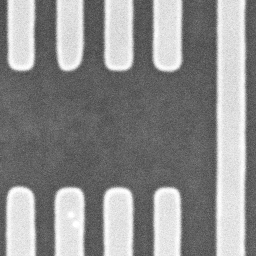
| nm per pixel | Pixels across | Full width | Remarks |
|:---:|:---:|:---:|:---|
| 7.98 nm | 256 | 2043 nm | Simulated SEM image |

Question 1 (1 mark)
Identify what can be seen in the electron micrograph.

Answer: wiring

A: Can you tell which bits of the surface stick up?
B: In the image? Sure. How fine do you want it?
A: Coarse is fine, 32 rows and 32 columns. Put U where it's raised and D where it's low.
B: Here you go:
DUUUDDDUUUDDDUUUDDDUUUUDDDDUUUDD
DUUUDDDUUUDDDUUUDDDUUUUDDDDUUUDD
DUUUDDDUUUDDDUUUDDDUUUUDDDDUUUDD
DUUUDDDUUUDDDUUUDDDUUUUDDDDUUUDD
DUUUDDDUUUDDDUUUDDDUUUUDDDDUUUDD
DUUUDDDUUUDDDUUUDDDUUUUDDDDUUUDD
DUUUDDDUUUDDDUUUDDDUUUUDDDDUUUDD
DUUUDDDUUUDDDUUUDDDUUUUDDDDUUUDD
DDUUDDDDUDDDDDUUDDDDUUDDDDDUUUDD
DDDDDDDDDDDDDDDDDDDDDDDDDDDUUUDD
DDDDDDDDDDDDDDDDDDDDDDDDDDDUUUDD
DDDDDDDDDDDDDDDDDDDDDDDDDDDUUUDD
DDDDDDDDDDDDDDDDDDDDDDDDDDDUUUDD
DDDDDDDDDDDDDDDDDDDDDDDDDDDUUUDD
DDDDDDDDDDDDDDDDDDDDDDDDDDDUUUDD
DDDDDDDDDDDDDDDDDDDDDDDDDDDUUUDD
DDDDDDDDDDDDDDDDDDDDDDDDDDDUUUDD
DDDDDDDDDDDDDDDDDDDDDDDDDDDUUUDD
DDDDDDDDDDDDDDDDDDDDDDDDDDDUUUDD
DDDDDDDDDDDDDDDDDDDDDDDDDDDUUUDD
DDDDDDDDDDDDDDDDDDDDDDDDDDDUUUDD
DDDDDDDDDDDDDDDDDDDDDDDDDDDUUUDD
DDDDDDDDDDDDDDDDDDDDDDDDDDDUUUDD
DDDDDDDDDDDDDDDDDDDDDDDDDDDUUUDD
DUUUDDDUUUDDDUUUDDDUUUDDDDDUUUDD
DUUUDDDUUUDDDUUUDDDUUUDDDDDUUUDD
DUUUDDDUUUDDDUUUDDDUUUDDDDDUUUDD
DUUUDDDUUUDDDUUUDDDUUUDDDDDUUUDD
DUUUDDDUUUDDDUUUDDDUUUDDDDDUUUDD
DUUUDDDUUUDDDUUUDDDUUUDDDDDUUUDD
DUUUDDDUUUDDDUUUDDDUUUDDDDDUUUDD
DUUUDDDUUUDDDUUUDDDUUUDDDDDUUUDD